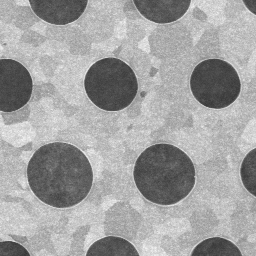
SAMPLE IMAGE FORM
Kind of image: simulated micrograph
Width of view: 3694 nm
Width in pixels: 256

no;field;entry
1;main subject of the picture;holes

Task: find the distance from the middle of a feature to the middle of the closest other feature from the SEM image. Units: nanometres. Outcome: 1500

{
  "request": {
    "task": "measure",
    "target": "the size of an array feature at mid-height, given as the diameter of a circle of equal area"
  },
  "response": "0.835 µm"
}